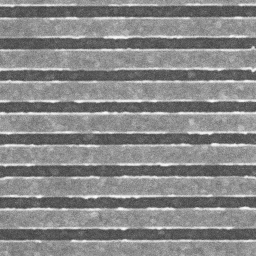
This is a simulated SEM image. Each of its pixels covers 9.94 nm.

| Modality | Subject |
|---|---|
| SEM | parallel lines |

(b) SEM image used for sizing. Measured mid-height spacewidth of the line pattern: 118 nanometers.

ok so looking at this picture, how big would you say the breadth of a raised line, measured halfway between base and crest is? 204 nm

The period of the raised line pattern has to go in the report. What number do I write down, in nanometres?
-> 316